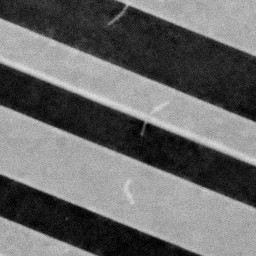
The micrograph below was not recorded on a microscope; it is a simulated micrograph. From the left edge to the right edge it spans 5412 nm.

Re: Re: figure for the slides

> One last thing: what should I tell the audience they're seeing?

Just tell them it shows lines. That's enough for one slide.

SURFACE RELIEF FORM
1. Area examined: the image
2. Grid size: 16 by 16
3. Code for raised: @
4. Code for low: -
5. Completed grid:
--------@@@@@@@@
@----------@@@@@
@@@----------@@@
@@@@@@----------
--@@@@@@--------
----@@@@@@@-----
-------@@@@@@---
@@-------@@@@@@@
@@@@@------@@@@@
@@@@@@@-------@@
@@@@@@@@@@------
--@@@@@@@@@@----
----@@@@@@@@@@@-
-------@@@@@@@@@
@@-------@@@@@@@
@@@@@------@@@@@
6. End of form